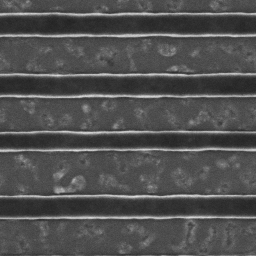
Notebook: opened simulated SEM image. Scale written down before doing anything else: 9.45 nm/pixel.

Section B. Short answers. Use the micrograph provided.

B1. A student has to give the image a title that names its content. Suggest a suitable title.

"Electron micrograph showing parallel lines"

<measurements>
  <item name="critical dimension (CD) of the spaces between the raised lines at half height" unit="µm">0.364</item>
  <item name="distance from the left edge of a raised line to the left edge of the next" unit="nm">573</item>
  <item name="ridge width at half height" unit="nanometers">208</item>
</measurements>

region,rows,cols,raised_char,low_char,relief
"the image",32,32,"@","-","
--------------------------------
--------------------------------
@@@@@@@@@@@@@@@@@@@@@@@@@@@@@@@@
@@@@@@@@@@@@@@@@@@@@@@@@@@@@@@@@
----------------------@@@---@@@-
--------------------------------
--------------------------------
--------------------------------
--------------------------------
@@@@@@@@@@@@@@@@@@@@@@@@@@@@@@@@
@@@@@@@@@@@@@@@@@@@@@@@@@@@@@@@@
@@@@@@@@@@@@@@@@@@@@@@@@@@@@@@@@
--------------------------------
--------------------------------
--------------------------------
--------------------------------
-----@@-@@----@@@@@@@@@@@@@---@-
@@@@@@@@@@@@@@@@@@@@@@@@@@@@@@@@
@@@@@@@@@@@@@@@@@@@@@@@@@@@@@@@@
--------------------------------
--------------------------------
--------------------------------
--------------------------------
--------------------------------
-----------@@@-------@@@@@@@@@@@
@@@@@@@@@@@@@@@@@@@@@@@@@@@@@@@@
@@@@@@@@@@@@@@@@@@@@@@@@@@@@@@@@
--------------------------------
--------------------------------
--------------------------------
--------------------------------
--------------------------------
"